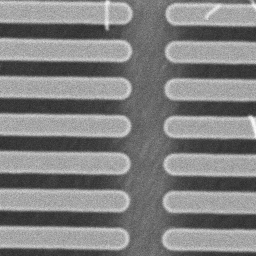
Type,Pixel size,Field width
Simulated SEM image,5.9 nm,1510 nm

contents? groups of lines, slits or small figures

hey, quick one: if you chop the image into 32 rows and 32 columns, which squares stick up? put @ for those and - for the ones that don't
@@@@@@@@@@@@@@@@----------------
@@@@@@@@@@@@@@@@-----@@@@@@@@@@@
@@@@@@@@@@@@@@@@-----@@@@@@@@@@@
--------------------------------
--------------------------------
@@@@@@@@@@@@@@@@-----@@@@@@@@@@@
@@@@@@@@@@@@@@@@-----@@@@@@@@@@@
@@@@@@@@@@@@@@@@-----@@@@@@@@@@@
--------------------------------
--------------------------------
@@@@@@@@@@@@@@@@-----@@@@@@@@@@@
@@@@@@@@@@@@@@@@-----@@@@@@@@@@@
----------------------@@@@@@@@@@
--------------------------------
@@@@@@@@@@@@@-------------------
@@@@@@@@@@@@@@@@-----@@@@@@@@@@@
@@@@@@@@@@@@@@@@-----@@@@@@@@@@@
--------------------------------
--------------------------------
@@@@@@@@@@@@@@@@-----@@@@@@@@@@@
@@@@@@@@@@@@@@@@-----@@@@@@@@@@@
@@@@@@@@@@@@@@@@-----@@@@@@@@@@@
--------------------------------
--------------------------------
@@@@@@@@@@@@@@@@-----@@@@@@@@@@@
@@@@@@@@@@@@@@@@-----@@@@@@@@@@@
---------------------@@@@@@@@@@@
--------------------------------
@@@@@@@@@-----------------------
@@@@@@@@@@@@@@@@----@@@@@@@@@@@@
@@@@@@@@@@@@@@@@-----@@@@@@@@@@@
--------------------------------